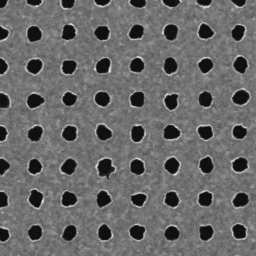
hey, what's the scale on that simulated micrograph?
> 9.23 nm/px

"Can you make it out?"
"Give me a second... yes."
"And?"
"a regular array of holes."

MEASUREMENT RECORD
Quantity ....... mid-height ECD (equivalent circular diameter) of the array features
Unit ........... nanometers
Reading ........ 131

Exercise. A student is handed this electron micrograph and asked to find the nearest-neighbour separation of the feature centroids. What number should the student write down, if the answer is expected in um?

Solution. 0.304